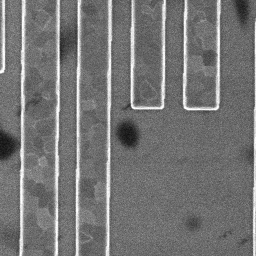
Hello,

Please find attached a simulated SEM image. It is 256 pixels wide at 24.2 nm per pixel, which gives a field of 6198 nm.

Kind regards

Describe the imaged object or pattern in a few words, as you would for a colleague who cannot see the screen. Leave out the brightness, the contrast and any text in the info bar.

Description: wiring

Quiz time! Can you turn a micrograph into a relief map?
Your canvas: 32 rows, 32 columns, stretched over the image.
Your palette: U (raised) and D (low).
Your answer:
DDDUUUUDDDUUUUDDDUUUUDDUUUUDDDDD
DDDUUUUDDDUUUUDDDUUUDDDUUUUDDDDD
DDDUUUUDDDUUUUDDDUUUDDDUUUUDDDDD
DDDUUUUDDDUUUUDDDUUUDDDUUUUDDDDD
DDDUUUUDDDUUUUDDDUUUDDDUUUUDDDDD
DDDUUUUDDDUUUUDDDUUUDDDUUUUDDDDD
DDDUUUUDDDUUUUDDDUUUDDDUUUUDDDDD
DDDUUUUDDDUUUUDDDUUUDDDUUUUDDDDD
DDDUUUUDDDUUUUDDDUUUDDDUUUUDDDDD
DDDUUUUDDDUUUUDDDUUUDDDUUUUDDDDD
DDDUUUUDDDUUUUDDDUUUDDDUUUUDDDDD
DDDUUUUDDDUUUUDDDUUUDDDUUUUDDDDD
DDDUUUUDDDUUUUDDDUUUDDDUUUUDDDDD
DDDUUUUDDDUUUUDDDDDDDDDDUUUDDDDD
DDDUUUUDDDUUUUDDDDDDDDDDDDDDDDDD
DDDUUUUDDDUUUUDDDDDDDDDDDDDDDDDD
DDDUUUUDDDUUUUDDDDDDDDDDDDDDDDDD
DDDUUUUDDDUUUUDDDDDDDDDDDDDDDDDD
DDDUUUUDDDUUUUDDDDDDDDDDDDDDDDDD
DDDUUUUDDDUUUUDDDDDDDDDDDDDDDDDD
DDDUUUUDDDUUUUDDDDDDDDDDDDDDDDDD
DDDUUUUDDDUUUDDDDDDDDDDDDDDDDDDD
DDDUUUUDDDUUUDDDDDDDDDDDDDDDDDDD
DDDUUUUDDDUUUDDDDDDDDDDDDDDDDDDD
DDDUUUUDDDUUUDDDDDDDDDDDDDDDDDDD
DDDUUUUDDDUUUDDDDDDDDDDDDDDDDDDD
DDDUUUUDDDUUUDDDDDDDDDDDDDDDDDDD
DDDUUUUDDDUUUDDDDDDDDDDDDDDDDDDD
DDDUUUUDDDUUUDDDDDDDDDDDDDDDDDDD
DDDUUUUDDDUUUDDDDDDDDDDDDDDDDDDD
DDDUUUUDDDUUUDDDDDDDDDDDDDDDDDDD
DDDUUUUDDDUUUDDDDDDDDDDDDDDDDDDD